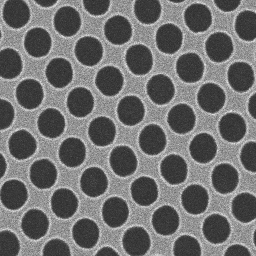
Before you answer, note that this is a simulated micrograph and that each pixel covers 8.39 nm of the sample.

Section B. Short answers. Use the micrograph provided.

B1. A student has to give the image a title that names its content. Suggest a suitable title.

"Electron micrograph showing a regular array of holes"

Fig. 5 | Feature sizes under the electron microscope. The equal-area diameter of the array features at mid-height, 28.6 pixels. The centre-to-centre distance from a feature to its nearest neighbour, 0.302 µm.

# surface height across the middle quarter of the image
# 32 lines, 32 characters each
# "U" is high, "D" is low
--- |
DDUUUUDUUUUUUUUUDDDDDDUUUUUUDDDD
DDUUUUUUUDDDDDUUUDDDDDUUUUUUDDDD
DDUUUUUUDDDDDDUUUUDDUUUUUUUUDDDD
DDUUUUUUDDDDDDDUUUUUUUDDDDUUUDDD
DDUUUUUUDDDDDDDUUUUUUDDDDDDUUUDD
DUUUUUUUDDDDDDDUUUUUUDDDDDDUUUUU
UUDDDDUUUDDDDDUUUUUUUDDDDDDDUUUU
UDDDDDDUUUDDDUUUUUUUUDDDDDDDUUUU
UDDDDDDUUUUUUUUDDDDUUUDDDDDUUUUU
UDDDDDDUUUUUUUDDDDDUUUDDDDUUUUUU
UDDDDDDUUUUUUDDDDDDDUUUUUUUUDDDU
UDDDDDDUUUUUUDDDDDDDUUUUUUUDDDDD
UUDDDDUUUUUUUDDDDDDDUUUUUUDDDDDD
UUUUUUUUDDDUUUDDDDDDUUUUUUDDDDDD
UUUUUUUDDDDDUUDDDDDUUUUUUUDDDDDD
UUUUUUDDDDDDDUUUDUUUUDDDUUDDDDDD
UUUUUUDDDDDDDUUUUUUUDDDDDUUDDDDD
UUUUUUDDDDDDDUUUUUUDDDDDDUUUUUUU
UDDUUUUDDDDDDUUUUUUDDDDDDUUUUUUU
DDDDDUUDDDDDUUUUUUUDDDDDDDUUUUUU
DDDDDUUUUDUUUUDUUUUDDDDDDUUUUUUD
DDDDDUUUUUUUDDDDDUUUDDDDDUUUUUUD
DDDDDUUUUUUUDDDDDDUUUDDDUUUUUUUU
DDDDDUUUUUUDDDDDDDUUUUUUUDDDDDUU
DDDDDUUUUUUDDDDDDDUUUUUUDDDDDDUU
UDDDUUUUUUUUDDDDDDUUUUUUDDDDDDDU
UUUUUDDDDDUUDDDDDDUUUUUUDDDDDDDU
UUUUUDDDDDUUUDDDDUUUUUUUDDDDDDDU
UUUUDDDDDDDUUUUUUUUDDDUUUDDDDDUU
UUUUDDDDDDDUUUUUUDDDDDDUUUDDDDUU
UUUUDDDDDDDUUUUUUDDDDDDUUUUUUUUD
DUUUDDDDDDDUUUUUUDDDDDDUUUUUUUDD